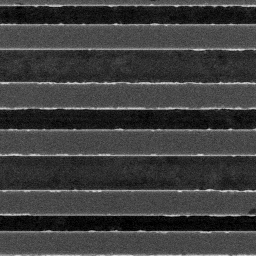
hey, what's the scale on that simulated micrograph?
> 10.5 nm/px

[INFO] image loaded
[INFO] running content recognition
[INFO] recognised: lines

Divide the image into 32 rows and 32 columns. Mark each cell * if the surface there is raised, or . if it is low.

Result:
********************************
................................
................................
********************************
********************************
********************************
................................
................................
................................
................................
********************************
********************************
********************************
****.**.************************
................................
................................
********************************
********************************
********************************
.............................*..
................................
................................
................................
................................
********************************
********************************
********************************
................................
................................
********************************
********************************
********************************